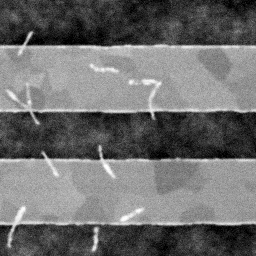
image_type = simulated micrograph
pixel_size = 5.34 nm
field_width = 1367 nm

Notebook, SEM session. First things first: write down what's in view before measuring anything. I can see lines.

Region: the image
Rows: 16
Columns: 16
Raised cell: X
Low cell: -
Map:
----------------
----------------
----------------
XXXXXXXXXXXXXXXX
XXXXXXXXXXXXXXXX
XXXXXXXXXXXXXXXX
XXXXXXXXXXXXXXXX
----------------
----------------
----------------
XXXXXXXXXXXXXXXX
XXXXXXXXXXXXXXXX
XXXXXXXXXXXXXXXX
XXXXXXXXXXXXXXXX
----------------
----------------